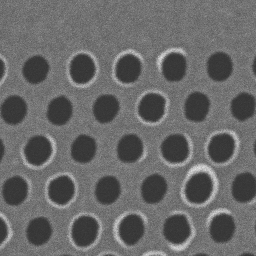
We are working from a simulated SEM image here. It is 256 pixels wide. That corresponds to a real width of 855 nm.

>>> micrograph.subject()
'a regular array of holes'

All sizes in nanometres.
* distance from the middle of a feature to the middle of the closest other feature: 152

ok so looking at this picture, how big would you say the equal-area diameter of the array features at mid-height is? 93.5 nm